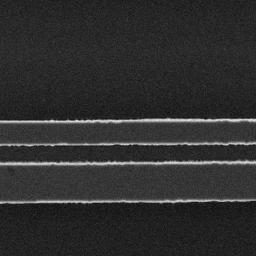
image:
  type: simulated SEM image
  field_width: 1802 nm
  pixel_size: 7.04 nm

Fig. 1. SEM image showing lines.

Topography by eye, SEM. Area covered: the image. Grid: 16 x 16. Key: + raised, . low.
................
................
................
................
................
................
................
................
++++++++++++++++
++++++++++++++++
++++++++++++++++
++++++++++++++++
++++++++++++++++
................
................
................